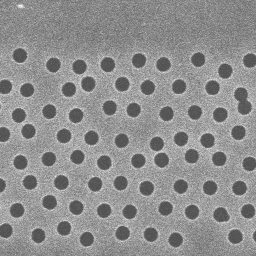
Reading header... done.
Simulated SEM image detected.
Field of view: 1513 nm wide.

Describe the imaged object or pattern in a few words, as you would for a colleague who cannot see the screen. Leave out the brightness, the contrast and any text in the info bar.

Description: a regular array of holes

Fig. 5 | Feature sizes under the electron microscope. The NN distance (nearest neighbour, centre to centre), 24.5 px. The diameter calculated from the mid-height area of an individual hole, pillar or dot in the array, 88.5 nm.